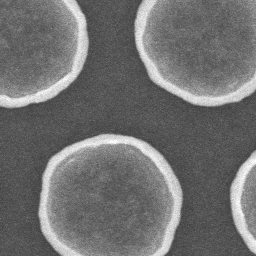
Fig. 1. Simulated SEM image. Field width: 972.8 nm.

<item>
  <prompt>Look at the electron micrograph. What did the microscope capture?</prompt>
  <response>raised bodies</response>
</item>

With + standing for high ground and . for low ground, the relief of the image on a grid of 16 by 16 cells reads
+++++....+++++++
+++++....+++++++
+++++....+++++++
+++++....+++++++
+++++.....++++++
++++.......+++++
................
................
................
....+++++.......
...+++++++.....+
...++++++++....+
...++++++++....+
...++++++++....+
...++++++++....+
....++++++......